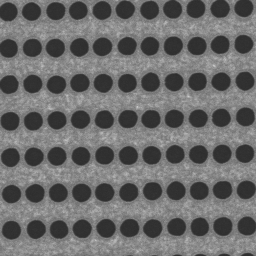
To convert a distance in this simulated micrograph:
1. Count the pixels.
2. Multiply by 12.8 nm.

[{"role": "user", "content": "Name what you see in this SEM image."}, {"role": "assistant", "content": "a regular array of holes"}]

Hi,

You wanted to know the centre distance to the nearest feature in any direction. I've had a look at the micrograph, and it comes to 0.298 micrometres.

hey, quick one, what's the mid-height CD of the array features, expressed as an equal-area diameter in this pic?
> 244 nm